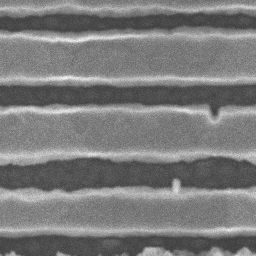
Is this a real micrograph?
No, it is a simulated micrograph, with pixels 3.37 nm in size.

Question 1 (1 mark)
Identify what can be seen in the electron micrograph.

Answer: one or a few lines or trenches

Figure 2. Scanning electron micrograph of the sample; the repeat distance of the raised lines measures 77.2 px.